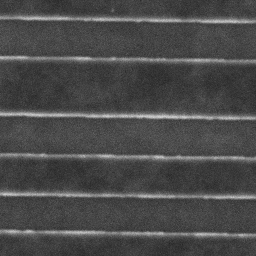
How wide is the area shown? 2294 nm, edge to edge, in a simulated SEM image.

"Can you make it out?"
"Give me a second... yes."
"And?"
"lines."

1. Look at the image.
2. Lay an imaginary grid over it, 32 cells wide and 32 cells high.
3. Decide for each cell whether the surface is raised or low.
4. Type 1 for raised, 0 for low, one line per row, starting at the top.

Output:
11111111111111111111111111111111
11111111111111111111111111111111
00000000001111111111111111111111
00000000000000000000000000000000
00000000000000000000000000000000
00000000000000000000000000000000
00000000000000000000000000000000
11111111111111111111111111110000
11111111111111111111111111111111
11111111111111111111111111111111
11111111111111111111111111111111
11111111111111111111111111111111
11111111111111111111111111111111
11111111111111111111111111111111
00000000001111111111111111111111
00000000000000000000000000000000
00000000000000000000000000000000
00000000000000000000000000000000
00000000000000000000000000000000
11111111111111100000000000000000
11111111111111111111111111111111
11111111111111111111111111111111
11111111111111111111111111111111
11111111111111111111111111111111
00000001111111111111111111111111
00000000000000000000000000000000
00000000000000000000000000000000
00000000000000000000000000000000
00000000000000000000000000000000
11111111111111111111111111111111
11111111111111111111111111111111
11111111111111111111111111111111